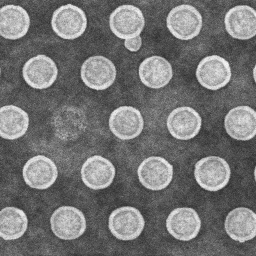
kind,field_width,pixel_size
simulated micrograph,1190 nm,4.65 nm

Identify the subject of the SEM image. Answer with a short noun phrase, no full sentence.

a regular array of raised bodies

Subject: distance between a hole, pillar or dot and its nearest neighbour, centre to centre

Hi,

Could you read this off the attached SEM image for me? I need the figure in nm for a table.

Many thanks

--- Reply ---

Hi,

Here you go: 266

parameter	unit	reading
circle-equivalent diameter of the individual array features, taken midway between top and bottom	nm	153